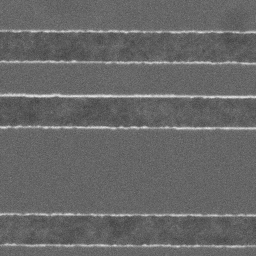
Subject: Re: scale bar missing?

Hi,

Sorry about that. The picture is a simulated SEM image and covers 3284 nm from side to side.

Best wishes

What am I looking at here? lines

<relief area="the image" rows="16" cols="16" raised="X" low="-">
XXXXXXXXXXXXXXXX
XXXXXXXXXXXXXXXX
----------------
----------------
XXXXXXXXXXXXXXXX
XXXXXXXXXXXXXXXX
----------------
----------------
XXXXXXXXXXXXXXXX
XXXXXXXXXXXXXXXX
XXXXXXXXXXXXXXXX
XXXXXXXXXXXXXXXX
XXXXXXXXXXXXXXXX
----------------
----------------
XXXXXXXXXXXXXXXX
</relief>